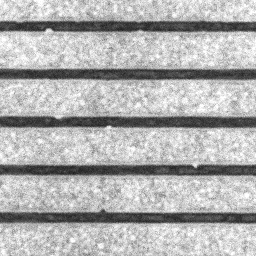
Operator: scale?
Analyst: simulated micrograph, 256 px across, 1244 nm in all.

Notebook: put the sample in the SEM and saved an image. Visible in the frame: parallel lines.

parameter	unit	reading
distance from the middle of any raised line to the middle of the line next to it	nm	233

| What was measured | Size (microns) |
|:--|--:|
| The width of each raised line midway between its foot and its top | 0.177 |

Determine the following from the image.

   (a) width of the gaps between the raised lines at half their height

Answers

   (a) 0.0529 µm